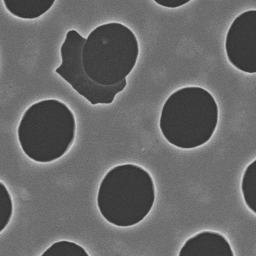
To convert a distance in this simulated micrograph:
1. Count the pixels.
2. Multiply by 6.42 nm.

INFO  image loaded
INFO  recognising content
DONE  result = holes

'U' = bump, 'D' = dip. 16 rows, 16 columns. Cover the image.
DDDUUUUUUUUUUUUU
UUUUUUUUUUUUUUUD
UUUUDDDDDUUUUUDD
UUUUDDDDDUUUUUDD
UUUUDDDDUUUUUUUD
UUUUUDDDUUUUUUUU
UUDDUUUUUUDDDUUU
UDDDDUUUUUDDDDUU
UDDDDUUUUUDDDUUU
UUDDUUUUUUUUUUUU
UUUUUUUDDUUUUUUD
UUUUUUDDDDUUUUUD
DUUUUUDDDDUUUUUD
DUUUUUDDDUUUUUUU
UUUUUUUUUUUUUUUU
UUUDDUUUUUUDDDUU